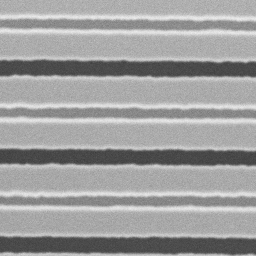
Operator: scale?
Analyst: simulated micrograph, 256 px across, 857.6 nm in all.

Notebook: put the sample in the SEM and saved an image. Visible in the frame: lines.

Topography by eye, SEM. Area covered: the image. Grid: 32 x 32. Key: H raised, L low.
HHHHHHHHHHHHHHHHHHHHHHHHHHHHHHHH
HHHHHHHHHHHHHHHHHHHHHHHHHHHHHHHH
HHHHHHHHHHHHHHHHHHHHHHHHHHHHHHHH
HHHHHHHHHHHHHHHHHHHHHHHHHHHHHHHH
HHHHHHHHHHHHHHHHHHHHHHHHHHHHHHHH
HHHHHHHHHHHHHHHHHHHHHHHHHHHHHHHH
HHHHHHHHHHHHHHHHHHHHHHHHHHHHHHHH
LLLLLLLLLLHLLHHLHHHHHHHHHHHHHHHH
LLLLLLLLLLLLLLLLLLLLLLLLLLLLLLLL
LHHHLLHLLLLLLLLLLLLLLLLLLLLLLLLL
HHHHHHHHHHHHHHHHHHHHHHHHHHHHHHHH
HHHHHHHHHHHHHHHHHHHHHHHHHHHHHHHH
HHHHHHHHHHHHHHHHHHHHHHHHHHHHHHHH
HHHHHHHHHHHHHHHHHHHHHHHHHHHHHHHH
HHHHHHHHHHHHHHHHHHHHHHHHHHHHHHHH
HHHHHHHHHHHHHHHHHHHHHHHHHHHHHHHH
HHHHHHHHHHHHHHHHHHHHHHHHHHHHHHHH
HHHHHHHHHHHHHHHHHHHHHHHHHHHHHHHH
LLHHLHHHHHHHHHHHHHHHHHHHHHHHHHHH
LLLLLLLLLLLLLLLLLLLLLLLLLLLLLLLL
LLLLLLHLLLLLLLLLLLLLLLLLLLLLLLLL
HHHHHHHHHHHHHHHHHHHHHHHHHHHHHHHH
HHHHHHHHHHHHHHHHHHHHHHHHHHHHHHHH
HHHHHHHHHHHHHHHHHHHHHHHHHHHHHHHH
HHHHHHHHHHHHHHHHHHHHHHHHHHHHHHHH
HHHHHHHHHHHHHHHHHHHHHHHHHHHHHHHH
HHHHHHHHHHHHHHHHHHHHHHHHHHHHHHHH
HHHHHHHHHHHHHHHHHHHHHHHHHHHHHHHH
HHHHHHHHHHHHHHHHHHHHHHHHHHHHHHHH
HHHHHHHHHHHHHHHHHHHHHHHHHHHHHHHH
LLLLLLLLLLLLLLLLLLLLLLLLLLLLLLLL
LLLLLLLLLLLLLLLLLLLLLLLLLLLLLLLL